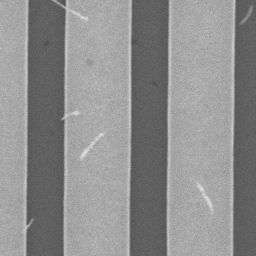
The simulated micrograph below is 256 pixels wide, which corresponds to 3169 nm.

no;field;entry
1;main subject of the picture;wiring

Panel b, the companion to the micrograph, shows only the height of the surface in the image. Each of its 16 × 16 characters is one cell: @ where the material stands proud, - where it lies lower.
@@--@@@@---@@@@-
@@--@@@@---@@@@-
@@--@@@@---@@@@-
@@--@@@@---@@@@-
@@--@@@@---@@@@-
@@--@@@@---@@@@-
@@--@@@@---@@@@-
@@--@@@@---@@@@-
@@--@@@@---@@@@-
@@--@@@@---@@@@-
@@--@@@@--@@@@@-
@@--@@@@--@@@@@-
@@--@@@@--@@@@@-
@@--@@@@--@@@@@-
@@--@@@@--@@@@@-
@@--@@@@--@@@@@-